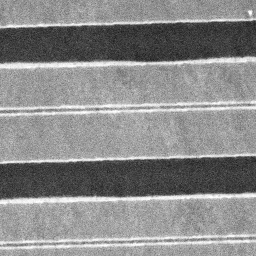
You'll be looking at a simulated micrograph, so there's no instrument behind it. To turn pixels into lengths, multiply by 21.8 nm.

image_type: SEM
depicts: lines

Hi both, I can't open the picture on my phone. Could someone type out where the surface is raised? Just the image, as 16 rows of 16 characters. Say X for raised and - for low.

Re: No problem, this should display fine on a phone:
XXXXXXXXXXXXXXXX
XXXXXX----------
----------------
----------------
XXXXXXXXXXXXXXXX
XXXXXXXXXXXXXXXX
XXXXXXXXXXXXXXXX
XXXXXXXXXXXXXXXX
XXXXXXXXXXXXXXXX
XXXXXXXXXXXXXXXX
----------------
----------------
------XXXXXXXXXX
XXXXXXXXXXXXXXXX
XXXXXXXXXXXXXXXX
XXXXXXXXXXXXXXXX